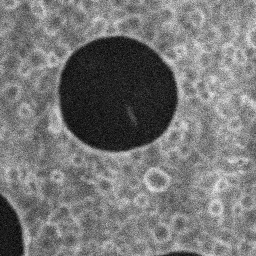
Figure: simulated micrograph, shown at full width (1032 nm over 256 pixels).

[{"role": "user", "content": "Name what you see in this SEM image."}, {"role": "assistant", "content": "holes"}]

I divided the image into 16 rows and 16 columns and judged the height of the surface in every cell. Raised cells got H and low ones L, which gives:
HHHHHHHHHHHHHHHH
HHHHHHHHHHHHHHHH
HHHHHHLLLHHHHHHH
HHHHLLLLLLHHHHHH
HHHHLLLLLLLHHHHH
HHHHLLLLLLLHHHHH
HHHHLLLLLLLHHHHH
HHHHLLLLLLLHHHHH
HHHHHLLLLLHHHHHH
HHHHHHHLHHHHHHHH
HHHHHHHHHHHHHHHH
HHHHHHHHHHHHHHHH
HHHHHHHHHHHHHHHH
LHHHHHHHHHHHHHHH
LHHHHHHHHHHHHHHH
LLHHHHHHHHHHHHHH